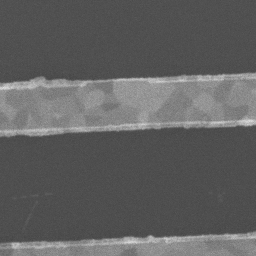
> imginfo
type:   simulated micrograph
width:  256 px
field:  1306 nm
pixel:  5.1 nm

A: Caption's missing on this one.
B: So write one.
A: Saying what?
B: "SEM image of one or a few lines or trenches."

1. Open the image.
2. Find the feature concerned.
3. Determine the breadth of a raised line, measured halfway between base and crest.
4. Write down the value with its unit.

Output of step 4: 258 nm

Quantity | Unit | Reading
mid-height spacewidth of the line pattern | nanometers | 551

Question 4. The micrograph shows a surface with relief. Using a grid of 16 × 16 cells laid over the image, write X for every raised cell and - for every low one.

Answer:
----------------
----------------
----------------
----------------
----------------
XXXXXXXXXXXXXXXX
XXXXXXXXXXXXXXXX
XXXXXXXXXXXXXXXX
X---------------
----------------
----------------
----------------
----------------
----------------
----------------
XXXXXXXXXXXXXXXX